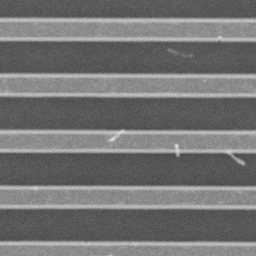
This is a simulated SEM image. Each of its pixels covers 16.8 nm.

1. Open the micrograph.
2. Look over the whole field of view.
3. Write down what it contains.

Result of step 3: parallel lines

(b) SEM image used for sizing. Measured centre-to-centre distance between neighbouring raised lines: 941 nanometers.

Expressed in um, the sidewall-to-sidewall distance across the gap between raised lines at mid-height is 0.598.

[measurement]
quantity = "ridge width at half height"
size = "339 nanometers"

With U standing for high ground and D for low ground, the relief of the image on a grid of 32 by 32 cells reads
DDDDDDDDDDDDDDDDDDDDDDDDDDDDDDDD
DDDDDDDDDDDDDDDDDDDDDDDDDDDDDDDD
DDDDDDDDDDDDDDDDDDDDDDDDDDDDDDDD
UUUUUUUUUUUUUUUUUUUUUUUUUUUUUUUU
UUUUUUUUUUUUUUUUUUUUUUUUUUUUUUUU
DDDDDDDDDDDDDDDDDDDDDDDDDDDDDDDD
DDDDDDDDDDDDDDDDDDDDDDDDDDDDDDDD
DDDDDDDDDDDDDDDDDDDDDDDDDDDDDDDD
DDDDDDDDDDDDDDDDDDDDDDDDDDDDDDDD
UUUUUUUUUUUUUUUUUUUDDDDDDDDDDDDD
UUUUUUUUUUUUUUUUUUUUUUUUUUUUUUUU
UUUUUUUUUUUUUUUUUUUUUUUUUUUUUUUU
DDDDDDDDDDDDDDDDDDDDDDDDDDDDDDDD
DDDDDDDDDDDDDDDDDDDDDDDDDDDDDDDD
DDDDDDDDDDDDDDDDDDDDDDDDDDDDDDDD
DDDDDDDDDDDDDDDDDDDDDDDDDDDDDDDD
DDDDDDDDDDDDDDDUDDDDDDDDDDDDDDDD
UUUUUUUUUUUUUUUUUUUUUUUUUUUUUUUU
UUUUUUUUUUUUUUUUUUUUUUUUUUUUUUUU
DDDDDDDDDDDDDDDDDDDDDDDDDDDDDDDD
DDDDDDDDDDDDDDDDDDDDDDDDDDDDDDDD
DDDDDDDDDDDDDDDDDDDDDDDDDDDDDDDD
DDDDDDDDDDDDDDDDDDDDDDDDDDDDDDDD
UUUUUUUUUUDDDDDDDDDDDDDDDDDDDDDD
UUUUUUUUUUUUUUUUUUUUUUUUUUUUUUUU
UUUUUUUUUUUUUUUUUUUUUUUUUUUUUUUU
DDDDDDDDDDDDDDDDDDDDDDDDDDDDDDDD
DDDDDDDDDDDDDDDDDDDDDDDDDDDDDDDD
DDDDDDDDDDDDDDDDDDDDDDDDDDDDDDDD
DDDDDDDDDDDDDDDDDDDDDDDDDDDDDDDD
UUUUUUUUUUUUUUUUUUUUUUUUUUUUDDDD
UUUUUUUUUUUUUUUUUUUUUUUUUUUUUUUU